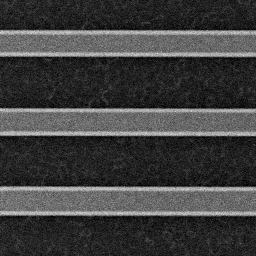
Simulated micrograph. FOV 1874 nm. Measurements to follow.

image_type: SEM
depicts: one or a few lines or trenches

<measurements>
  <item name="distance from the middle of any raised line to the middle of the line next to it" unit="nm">577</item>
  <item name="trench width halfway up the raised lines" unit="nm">408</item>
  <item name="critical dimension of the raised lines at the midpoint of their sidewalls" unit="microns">0.169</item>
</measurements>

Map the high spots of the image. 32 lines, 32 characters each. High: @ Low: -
--------------------------------
--------------------------------
--------------------------------
--------------------------------
@@@@@@@@@@@@@@@@@@@@@@@@@@@@@@@@
@@@@@@@@@@@@@@@@@@@@@@@@@@@@@@@@
@@@@@@@@@@@@@@@@@@@@@@@@@@@@@@@@
--------------------------------
--------------------------------
--------------------------------
--------------------------------
--------------------------------
--------------------------------
--------------------------------
@@@@@@@@@@@@@@@@@@@@@@@@@@@@@@@@
@@@@@@@@@@@@@@@@@@@@@@@@@@@@@@@@
@@@@@@@@@@@@@@@@@@@@@@@@@@@@@@@@
--------------------------------
--------------------------------
--------------------------------
--------------------------------
--------------------------------
--------------------------------
--------------------------------
@@@@@@@@@@@@@@@@@@@@@@@@@@@@@@@@
@@@@@@@@@@@@@@@@@@@@@@@@@@@@@@@@
@@@@@@@@@@@@@@@@@@@@@@@@@@@@@@@@
--------------------------------
--------------------------------
--------------------------------
--------------------------------
--------------------------------